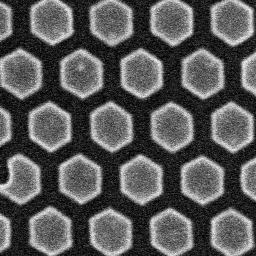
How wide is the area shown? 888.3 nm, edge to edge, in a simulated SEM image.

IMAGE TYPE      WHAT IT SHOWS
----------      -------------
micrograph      a regular array of raised bodies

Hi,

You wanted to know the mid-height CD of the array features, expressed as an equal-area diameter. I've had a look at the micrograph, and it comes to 152 nanometres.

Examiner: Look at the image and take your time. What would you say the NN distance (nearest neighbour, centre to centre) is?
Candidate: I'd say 209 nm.